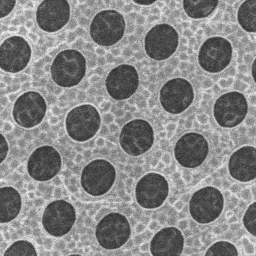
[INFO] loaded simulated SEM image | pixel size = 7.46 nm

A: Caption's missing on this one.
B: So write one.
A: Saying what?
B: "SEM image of a regular array of holes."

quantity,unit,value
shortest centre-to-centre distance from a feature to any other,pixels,55.5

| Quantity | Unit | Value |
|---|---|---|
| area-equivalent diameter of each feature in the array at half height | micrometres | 0.271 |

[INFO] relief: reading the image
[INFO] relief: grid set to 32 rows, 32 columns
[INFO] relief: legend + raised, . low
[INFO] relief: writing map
..+++....++++++++..++++....+++..
.+++.....+++...++++++++....+++..
+++++....++.....++++++++++++++..
+++++...+++.....+++...++++++++..
++.++++++++....+++....++++++++++
....++++++++..++++....+++....+++
....++++..++++++++....+++....+++
....+++....++++++++..++++....+++
...+++.....+++...++++++++...+++.
++++++.....++....++++++++++++++.
+++++++...+++....++++...++++++++
+++..++++++++....+++....+++++.++
++....++++++++++++++....+++....+
++....+++...++++++++....+++....+
++....++.....++++++++++++++....+
++...+++.....+++...++++++++...++
++++++++....+++....+++++++++++++
.++++++++..++++....+++....++++++
.++++..++++++++....+++....++++..
.+++....++++++++.+++++....+++...
+++.....+++...++++++++...++++...
+++....+++....+++++++++++++++...
++++..++++....+++....+++++++++..
..++++++++....+++....++++..+++++
...+++++++++.++++....+++....++++
...+++...++++++++...++++....+++.
..+++....+++++++++++++++....+++.
..+++....++++...++++++++...+++..
++++++...+++....++++..+++++++++.
+++++++.++++....+++....+++++++++
+...++++++++....+++....++++..+++
+....++++++++++++++....+++....++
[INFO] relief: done